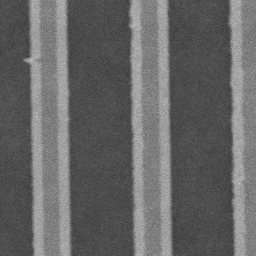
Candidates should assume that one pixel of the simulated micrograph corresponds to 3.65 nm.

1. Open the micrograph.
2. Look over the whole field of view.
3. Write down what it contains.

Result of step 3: one or a few lines or trenches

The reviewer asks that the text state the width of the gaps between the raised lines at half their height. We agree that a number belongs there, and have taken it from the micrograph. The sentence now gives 268 nanometers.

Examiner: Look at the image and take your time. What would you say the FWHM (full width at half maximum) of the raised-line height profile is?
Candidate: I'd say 101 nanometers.